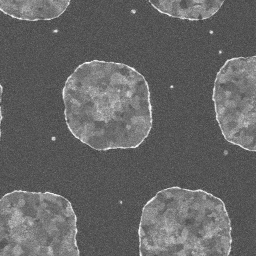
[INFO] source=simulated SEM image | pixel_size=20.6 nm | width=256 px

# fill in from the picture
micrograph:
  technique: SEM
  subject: raised bodies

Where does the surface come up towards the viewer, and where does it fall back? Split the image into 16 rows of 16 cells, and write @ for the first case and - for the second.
@@@@------@@@@--
----------------
----------------
----------------
-----@@@@-----@@
----@@@@@----@@@
----@@@@@----@@@
----@@@@@-----@@
-----@@@@-----@@
----------------
----------------
----------------
@@@@-----@@@@@--
@@@@@----@@@@@--
@@@@@----@@@@@--
@@@@@----@@@@@--